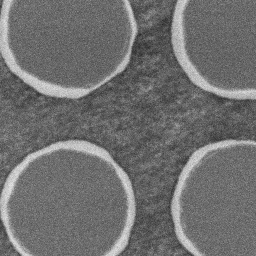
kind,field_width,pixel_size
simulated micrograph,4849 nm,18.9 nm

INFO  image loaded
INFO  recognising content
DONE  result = raised bodies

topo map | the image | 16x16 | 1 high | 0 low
1111111100011111
1111111100011111
1111111100011111
0111111100011111
0111111000001111
0001110000000111
0000000000000000
0000000000000000
0000000000000000
0001110000000111
0111111000001111
0111111100011111
1111111100011111
1111111100011111
0111111100011111
0111111100001111